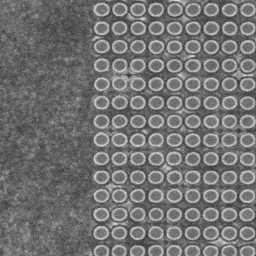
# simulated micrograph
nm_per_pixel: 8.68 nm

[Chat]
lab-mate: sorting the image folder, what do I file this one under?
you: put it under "a regular array of raised bodies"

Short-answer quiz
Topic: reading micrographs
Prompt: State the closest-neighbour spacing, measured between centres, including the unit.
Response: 157 nm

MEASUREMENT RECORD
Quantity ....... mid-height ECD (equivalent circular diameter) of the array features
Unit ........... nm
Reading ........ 118